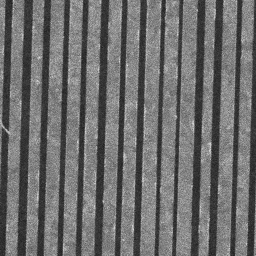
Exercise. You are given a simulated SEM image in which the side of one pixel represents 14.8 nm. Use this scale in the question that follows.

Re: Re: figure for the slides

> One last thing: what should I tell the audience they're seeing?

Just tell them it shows parallel lines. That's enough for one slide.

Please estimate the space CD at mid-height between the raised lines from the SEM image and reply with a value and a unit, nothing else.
0.107 microns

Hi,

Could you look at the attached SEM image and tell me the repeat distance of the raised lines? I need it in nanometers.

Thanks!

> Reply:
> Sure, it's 283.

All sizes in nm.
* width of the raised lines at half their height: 179